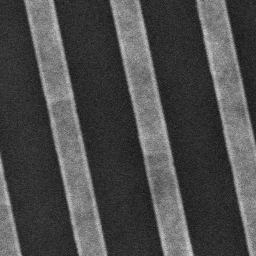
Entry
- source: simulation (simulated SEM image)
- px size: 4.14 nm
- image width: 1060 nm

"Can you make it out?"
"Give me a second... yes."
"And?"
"one or a few lines or trenches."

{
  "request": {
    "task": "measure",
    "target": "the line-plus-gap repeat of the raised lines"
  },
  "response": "0.348 um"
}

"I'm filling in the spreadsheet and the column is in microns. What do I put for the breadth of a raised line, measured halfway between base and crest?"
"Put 0.102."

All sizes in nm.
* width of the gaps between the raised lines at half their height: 245